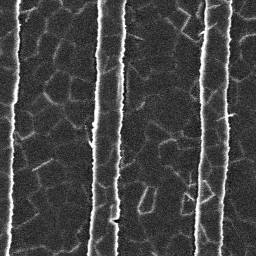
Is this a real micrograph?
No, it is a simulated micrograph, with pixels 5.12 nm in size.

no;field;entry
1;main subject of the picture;one or a few lines or trenches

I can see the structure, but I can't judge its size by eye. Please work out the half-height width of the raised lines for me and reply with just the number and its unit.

135 nm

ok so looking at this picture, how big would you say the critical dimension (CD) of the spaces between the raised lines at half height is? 412 nm